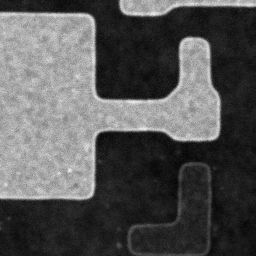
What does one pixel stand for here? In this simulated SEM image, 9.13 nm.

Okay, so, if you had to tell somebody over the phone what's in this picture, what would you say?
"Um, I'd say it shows wiring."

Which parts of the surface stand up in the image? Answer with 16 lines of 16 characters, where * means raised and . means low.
........***.....
******..........
******......*...
******.....**...
******.....**...
******.....**...
**************..
**************..
******.....**...
******..........
******.....**...
******.....**...
...........**...
...........**...
........*****...
........*****...